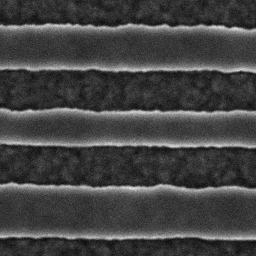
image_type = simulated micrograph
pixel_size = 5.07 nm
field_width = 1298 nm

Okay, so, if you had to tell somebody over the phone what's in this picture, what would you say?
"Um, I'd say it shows lines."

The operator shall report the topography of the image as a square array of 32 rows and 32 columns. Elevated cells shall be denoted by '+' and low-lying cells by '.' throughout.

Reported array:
................................
................................
................................
++++++++++++++++++++++++++++++..
++++++++++++++++++++++++++++++++
++++++++++++++++++++++++++++++++
++++++++++++++++++++++++++++++++
++++++++++++++++++++++++++++++++
++++++++++++++++++++++++++++++++
................................
................................
................................
................................
................................
++++++++++++++++++++++++++++++++
++++++++++++++++++++++++++++++++
++++++++++++++++++++++++++++++++
++++++++++++++++++++++++++++++++
................................
................................
................................
................................
................................
+++++++++++++++++++++++...+++++.
++++++++++++++++++++++++++++++++
++++++++++++++++++++++++++++++++
++++++++++++++++++++++++++++++++
++++++++++++++++++++++++++++++++
++++++++++++++++++++++++++++++++
++++++++++++++++++++++++++++++++
................................
................................